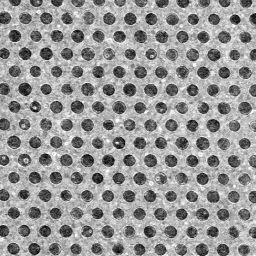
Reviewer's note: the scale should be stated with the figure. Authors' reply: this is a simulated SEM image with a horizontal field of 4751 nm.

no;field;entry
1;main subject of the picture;a regular array of holes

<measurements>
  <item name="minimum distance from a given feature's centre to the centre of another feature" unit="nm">378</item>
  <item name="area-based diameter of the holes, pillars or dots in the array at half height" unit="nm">235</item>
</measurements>